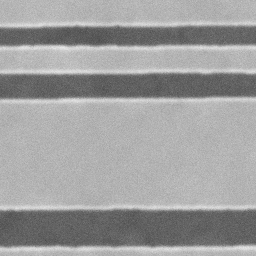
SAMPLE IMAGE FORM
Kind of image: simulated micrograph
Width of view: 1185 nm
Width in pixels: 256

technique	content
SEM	lines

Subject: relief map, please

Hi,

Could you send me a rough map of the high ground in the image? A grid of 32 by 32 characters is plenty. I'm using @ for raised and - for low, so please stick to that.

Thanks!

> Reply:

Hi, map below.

@@@@@@@@@@@@@@@@@@@@@@@@@@@@@@@@
@@@@@@@@@@@@@@@@@@@@@@@@@@@@@@@@
@@@@@@@@@@@@@@@@@@@@@@@@@@@@@@@@
--------------------------------
--------------------------------
--------------------------------
@@@@@@@@@@@@@@@@@@@@@@@@@@@@@@@@
@@@@@@@@@@@@@@@@@@@@@@@@@@@@@@@@
@@@@@@@@@@@@@@@@@@@@@@@@@@@@@@@@
--------------------------------
--------------------------------
--------------------------------
-------@@@@@@@@@@@@@@@@@@@@@@@@@
@@@@@@@@@@@@@@@@@@@@@@@@@@@@@@@@
@@@@@@@@@@@@@@@@@@@@@@@@@@@@@@@@
@@@@@@@@@@@@@@@@@@@@@@@@@@@@@@@@
@@@@@@@@@@@@@@@@@@@@@@@@@@@@@@@@
@@@@@@@@@@@@@@@@@@@@@@@@@@@@@@@@
@@@@@@@@@@@@@@@@@@@@@@@@@@@@@@@@
@@@@@@@@@@@@@@@@@@@@@@@@@@@@@@@@
@@@@@@@@@@@@@@@@@@@@@@@@@@@@@@@@
@@@@@@@@@@@@@@@@@@@@@@@@@@@@@@@@
@@@@@@@@@@@@@@@@@@@@@@@@@@@@@@@@
@@@@@@@@@@@@@@@@@@@@@@@@@@@@@@@@
@@@@@@@@@@@@@@@@@@@@@@@@@@@@@@@@
@@@@@@@@@@@@@@@@@@@@@@@@@@@@@@@@
--------------------------------
--------------------------------
--------------------------------
--------------------------------
--------------------------------
@@@@@@@@@@@@@@@@@@@@@@@@@@@@@@@@